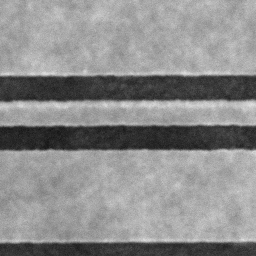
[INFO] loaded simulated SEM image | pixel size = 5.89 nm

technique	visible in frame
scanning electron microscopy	lines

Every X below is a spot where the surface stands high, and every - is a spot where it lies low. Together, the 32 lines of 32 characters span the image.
XXXXXXXXXXXXXXXXXXXXXXXXXXXXXXXX
XXXXXXXXXXXXXXXXXXXXXXXXXXXXXXXX
XXXXXXXXXXXXXXXXXXXXXXXXXXXXXXXX
XXXXXXXXXXXXXXXXXXXXXXXXXXXXXXXX
XXXXXXXXXXXXXXXXXXXXXXXXXXXXXXXX
XXXXXXXXXXXXXXXXXXXXXXXXXXXXXXXX
XXXXXXXXXXXXXXXXXXXXXXXXXXXXXXXX
XXXXXXXXXXXXXXXXXXXXXXXXXXXXXXXX
XXXXXXXXXXXXXXXXXXXXXXXXXXXXXXXX
--------X-----------------------
--------------------------------
--------------------------------
--------------------------------
XXXXXXXXXXXXXXXXXXXXXXXXXXXXXXXX
XXXXXXXXXXXXXXXXXXXXXXXXXXXXXXXX
XXXXXXXXXXXXXXXXXXXXXXXXXXXXXXXX
--------------------------------
--------------------------------
--------------------------------
XXXXXXXXXXXXXXXXXXXXXXXXXXXXXXXX
XXXXXXXXXXXXXXXXXXXXXXXXXXXXXXXX
XXXXXXXXXXXXXXXXXXXXXXXXXXXXXXXX
XXXXXXXXXXXXXXXXXXXXXXXXXXXXXXXX
XXXXXXXXXXXXXXXXXXXXXXXXXXXXXXXX
XXXXXXXXXXXXXXXXXXXXXXXXXXXXXXXX
XXXXXXXXXXXXXXXXXXXXXXXXXXXXXXXX
XXXXXXXXXXXXXXXXXXXXXXXXXXXXXXXX
XXXXXXXXXXXXXXXXXXXXXXXXXXXXXXXX
XXXXXXXXXXXXXXXXXXXXXXXXXXXXXXXX
XXXXXXXXXXXXXXXXXXXXXXXXXXXXXXXX
--------------------------------
--------------------------------